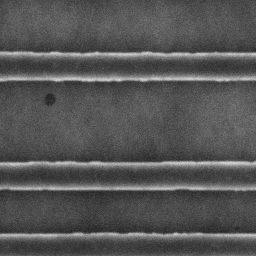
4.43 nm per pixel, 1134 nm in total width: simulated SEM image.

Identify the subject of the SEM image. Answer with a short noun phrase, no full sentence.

lines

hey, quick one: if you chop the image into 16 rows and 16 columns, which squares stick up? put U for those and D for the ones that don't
DDDDDDDDDDDDDDDD
DDDDDDDDDDDDDDDD
DDDDDDDDDDDDDDDD
UUUUUUUUUUUUUUUU
UUUUUUUUUUUUUUUU
DDDDDDDDDDDDDDDD
DDDDDDDDDDDDDDDD
DDDDDDDDDDDDDDDD
DDDDDDDDDDDDDDDD
DDDDDDDDDDDDDDDD
UUUUUUUUUUUUUUUU
UUUUUUUUUUUUUUUU
DDDDDDDDDDDDDDDD
DDDDDDDDDDDDDDDD
DDDDDDDDDDDDDDDD
UUUUUUUUUUUUUUUU